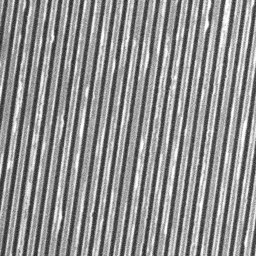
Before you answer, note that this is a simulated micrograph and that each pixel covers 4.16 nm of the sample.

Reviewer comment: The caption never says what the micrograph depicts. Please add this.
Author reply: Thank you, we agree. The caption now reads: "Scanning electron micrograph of parallel lines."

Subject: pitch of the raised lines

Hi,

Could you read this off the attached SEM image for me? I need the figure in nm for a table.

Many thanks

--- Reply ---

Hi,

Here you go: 44.8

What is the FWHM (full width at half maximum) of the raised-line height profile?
0.0232 microns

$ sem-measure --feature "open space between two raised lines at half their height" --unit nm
19.6